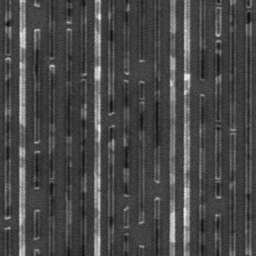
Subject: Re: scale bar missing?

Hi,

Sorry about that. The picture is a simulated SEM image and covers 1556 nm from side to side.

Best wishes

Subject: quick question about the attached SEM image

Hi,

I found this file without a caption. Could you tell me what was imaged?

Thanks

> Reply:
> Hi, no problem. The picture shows parallel lines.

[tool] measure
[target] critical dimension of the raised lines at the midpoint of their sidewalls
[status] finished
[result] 25.8 nm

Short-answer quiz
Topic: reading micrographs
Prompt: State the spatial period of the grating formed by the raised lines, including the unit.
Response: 91.5 nm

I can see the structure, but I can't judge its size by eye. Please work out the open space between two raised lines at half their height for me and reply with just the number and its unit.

10.4 pixels